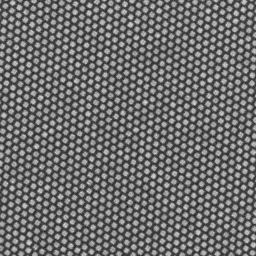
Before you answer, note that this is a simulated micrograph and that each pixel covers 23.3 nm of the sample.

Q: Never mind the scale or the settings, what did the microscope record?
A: a regular array of raised bodies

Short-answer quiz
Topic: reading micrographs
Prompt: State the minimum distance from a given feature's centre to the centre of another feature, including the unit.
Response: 182 nanometers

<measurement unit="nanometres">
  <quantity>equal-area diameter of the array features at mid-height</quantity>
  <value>111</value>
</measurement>